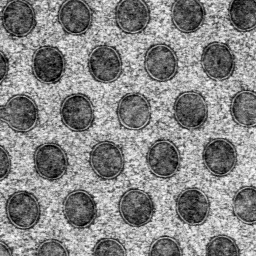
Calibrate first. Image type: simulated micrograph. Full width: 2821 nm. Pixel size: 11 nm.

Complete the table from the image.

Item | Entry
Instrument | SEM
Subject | a regular array of raised bodies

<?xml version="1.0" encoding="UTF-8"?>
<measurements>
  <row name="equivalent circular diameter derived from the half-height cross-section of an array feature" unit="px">33.1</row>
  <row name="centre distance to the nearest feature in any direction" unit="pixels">55.7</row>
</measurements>